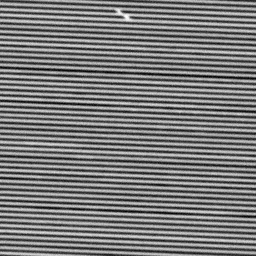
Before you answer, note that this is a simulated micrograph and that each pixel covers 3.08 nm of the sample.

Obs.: parallel lines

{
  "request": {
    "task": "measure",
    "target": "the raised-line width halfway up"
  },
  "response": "0.0088 microns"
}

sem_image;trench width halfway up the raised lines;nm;8.8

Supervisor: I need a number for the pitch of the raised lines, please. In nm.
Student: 17